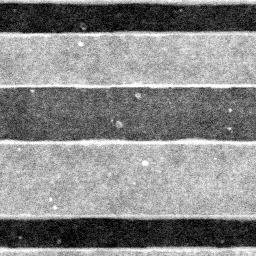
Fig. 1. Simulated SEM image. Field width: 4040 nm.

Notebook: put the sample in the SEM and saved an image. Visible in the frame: lines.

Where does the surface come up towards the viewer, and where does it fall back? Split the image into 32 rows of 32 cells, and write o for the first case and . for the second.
................................
................................
................................
................................
oooooooooooooooooooooooooooooooo
oooooooooooooooooooooooooooooooo
oooooooooooooooooooooooooooooooo
oooooooooooooooooooooooooooooooo
oooooooooooooooooooooooooooooooo
oooooooooooooooooooooooooooooooo
oooooooooooooooooooooooooooooooo
................................
................................
................................
................................
................................
................................
................................
oooooooooooooooooooooooooooooooo
oooooooooooooooooooooooooooooooo
oooooooooooooooooooooooooooooooo
oooooooooooooooooooooooooooooooo
oooooooooooooooooooooooooooooooo
oooooooooooooooooooooooooooooooo
oooooooooooooooooooooooooooooooo
oooooooooooooooooooooooooooooooo
oooooooooooooooooooooooooooooooo
................................
................................
................................
................................
oooooooooooooooooooooooooooooooo